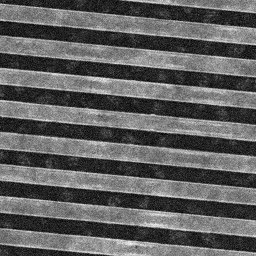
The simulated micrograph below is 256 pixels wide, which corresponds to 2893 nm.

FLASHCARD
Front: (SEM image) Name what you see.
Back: parallel lines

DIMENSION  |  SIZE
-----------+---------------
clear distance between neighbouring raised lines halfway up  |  16.4 px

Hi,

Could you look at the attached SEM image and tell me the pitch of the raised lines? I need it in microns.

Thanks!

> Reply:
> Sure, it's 0.36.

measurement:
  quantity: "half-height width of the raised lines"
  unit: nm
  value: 174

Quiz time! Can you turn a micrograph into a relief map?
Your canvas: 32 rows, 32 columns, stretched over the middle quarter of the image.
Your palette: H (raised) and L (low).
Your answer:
LLLLLLLLLLLLLLLLLLLLLLHHHHHLHHHH
LLLLLLLLLLLLLLLLLLLLLLLLLLLLLLLL
LLLLLLLLLLLLLLLLLLLLLLLLLLLLLLLL
HHHHHHHHLLLLLLLLLLLLLLLLLLLLLLLL
HHHHHHLLLLHHHHHHHHHLLLLLLLLLLLLL
HHHHHHLLLLHHHHHHHHHHHHHHHHHHHLLL
LHHHHHHLLLHHHHHHHHHHHHHHHHHHHHHH
LLLLLLLLLLLLHHHHHHHHHHHHHHHHHHHH
LLLLLLLLLLLLLLLLLLLLLLHHHHHHHHHH
LLLLLLLLLLLLLLLLLLLLLLLLLLLLLLLL
LLLLLLLLLLLLLLLLLLLLLLLLLLLLLLLL
HHHHHHLLLLLLLLLLLLLLLLLLLLLLLLLL
HHHHHHHLLLHHHHHHLLLLLLLLLLLLLLLL
HHHHHHHLLLHHHHHHHHHHHHHHHHHLLLLL
HHHHHHHHLHHHHHHHHHHHHHHHHHHHHHHH
LLLLLLLLLLLLHHHHHHHHHHHHHHHHHHHH
LLLLLLLLLLLLLLLLLLLLLLHHHHHHHHHH
LLLLLLLLLLLLLLLLLLLLLLLLLLLLLLLL
LLLLLLLLLLLLLLLLLLLLLLLLLLLLLLLL
HHHHHHHHHLLLLLLLLLLLLLLLLLLLLLLL
HHHHHHHHHHHHHHHHHHHLLLLLLLLLLLLL
HHHHHHHLLHHHHHHHHHHHHHHHHHHHHHLL
HHHHHHHLLHHHHHHHHHHHHHHHHHHHHHHH
LLLLLLLLLLHHHHHHHHHHHHHHHHHHHHHH
LLLLLLLLLLLLLLLLLLLLHHHHHHHHHHHH
LLLLLLLLLLLLLLLLLLLLLLLLLLLLLLHH
LLLLLLLLLLLLLLLLLLLLLLLLLLLLLLLL
HHHHHHHLLLLLLLLLLLLLLLLLLLLLLLLL
HHHHHHHHHHHHHHHHHLLLLLLLLLLLLLLL
HHHHHHHHHHHHHHHHHHHHHHHHHHHLLLLL
HHHHHHHHHHHHHHHHHHHHHHHHHHHHHHHH
LLLLLLLLLLHHHHHHHHHHHHHHHHHHHHHH